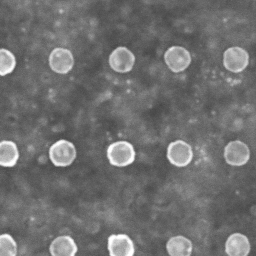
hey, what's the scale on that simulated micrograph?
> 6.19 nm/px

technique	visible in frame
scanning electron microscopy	a regular array of raised bodies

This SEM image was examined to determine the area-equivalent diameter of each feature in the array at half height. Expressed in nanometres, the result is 153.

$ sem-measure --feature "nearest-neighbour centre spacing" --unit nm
357